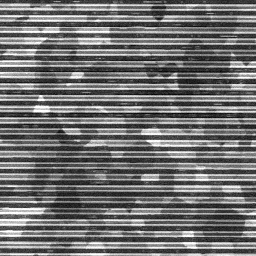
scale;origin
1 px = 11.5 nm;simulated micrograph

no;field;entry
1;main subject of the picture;parallel lines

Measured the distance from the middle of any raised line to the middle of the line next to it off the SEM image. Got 130 nanometres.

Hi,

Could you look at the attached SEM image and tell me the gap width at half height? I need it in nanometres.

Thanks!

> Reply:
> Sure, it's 76.2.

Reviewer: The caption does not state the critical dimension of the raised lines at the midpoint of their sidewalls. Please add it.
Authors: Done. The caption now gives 54.6 nm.